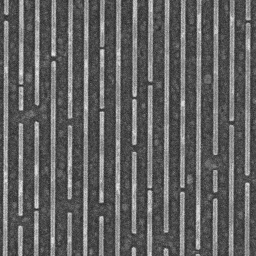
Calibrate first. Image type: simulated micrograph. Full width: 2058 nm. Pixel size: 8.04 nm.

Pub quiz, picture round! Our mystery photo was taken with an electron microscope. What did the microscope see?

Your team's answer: parallel lines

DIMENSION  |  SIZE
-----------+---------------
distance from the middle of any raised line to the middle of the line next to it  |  130 nanometers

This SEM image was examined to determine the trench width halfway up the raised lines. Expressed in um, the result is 0.101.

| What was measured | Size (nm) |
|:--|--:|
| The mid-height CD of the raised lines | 29.1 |